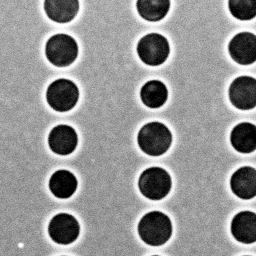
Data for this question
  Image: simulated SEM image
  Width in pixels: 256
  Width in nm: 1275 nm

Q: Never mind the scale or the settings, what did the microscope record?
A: a regular array of holes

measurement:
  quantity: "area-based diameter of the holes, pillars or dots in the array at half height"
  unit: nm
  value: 168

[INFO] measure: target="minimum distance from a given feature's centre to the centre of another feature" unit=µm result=0.223